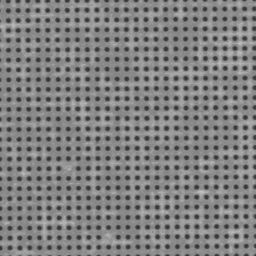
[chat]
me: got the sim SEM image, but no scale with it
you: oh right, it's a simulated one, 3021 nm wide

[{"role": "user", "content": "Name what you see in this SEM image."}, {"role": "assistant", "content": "a regular array of holes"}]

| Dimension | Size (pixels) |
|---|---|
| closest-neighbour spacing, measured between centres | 9.4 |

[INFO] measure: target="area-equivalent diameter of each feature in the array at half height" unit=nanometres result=58.1